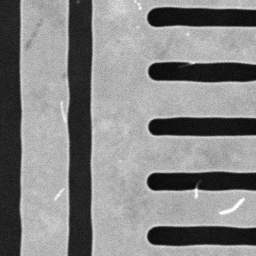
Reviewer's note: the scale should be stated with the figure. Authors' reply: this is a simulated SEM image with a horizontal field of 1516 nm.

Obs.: groups of lines, slits or small figures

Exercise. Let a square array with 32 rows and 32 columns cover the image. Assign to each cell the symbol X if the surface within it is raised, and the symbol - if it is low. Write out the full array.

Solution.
---XXXXXX---XXXXXXXXXXXXXXXXXXXX
---XXXXXX---XXXXXXX-------------
---XXXXX----XXXXXX--------------
---XXXXX----XXXXXXXXXXXXXXXXXXXX
---XXXXX----XXXXXXXXXXXXXXXXXXXX
---XXXXX----XXXXXXXXXXXXXXXXXXXX
---XXXXX----XXXXXXXXXXXXXXXXXXXX
---XXXXX----XXXXXXXXXXXXXXXXXXXX
---XXXXX----XXXXXXX-------------
---XXXXX----XXXXXXX-------------
---XXXXXX--XXXXXXXXXXXXXXXXXXXXX
---XXXXXX--XXXXXXXXXXXXXXXXXXXXX
---XXXXXX--XXXXXXXXXXXXXXXXXXXXX
---XXXXXX--XXXXXXXXXXXXXXXXXXXXX
---XXXXX---XXXXXXXXXXXXXXXXXXXXX
---XXXXX----XXXXXXX-------------
---XXXXX----XXXXXXX-------------
---XXXXXX---XXXXXXXXXXXXXXXXXXXX
---XXXXXX---XXXXXXXXXXXXXXXXXXXX
---XXXXXX--XXXXXXXXXXXXXXXXXXXXX
---XXXXXX--XXXXXXXXXXXXXXXXXXXXX
---XXXXXX--XXXXXXXXXXXXXXX--XXXX
---XXXXX----XXXXXX--------------
---XXXXXX---XXXXXXX-------------
---XXXXXX---XXXXXXXXXXXXXXXXXXXX
---XXXXXX---XXXXXXXXXXXXXXXXXXXX
---XXXXXX--XXXXXXXXXXXXXXXXXXXXX
---XXXXXX---XXXXXXXXXXXXXXXXXXXX
---XXXXXX---XXXXXXX-------------
---XXXXXX---XXXXXX--------------
---XXXXX----XXXXXXX-------------
---XXXXX----XXXXXXXXXXXXXXXXXXXX